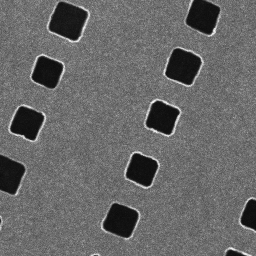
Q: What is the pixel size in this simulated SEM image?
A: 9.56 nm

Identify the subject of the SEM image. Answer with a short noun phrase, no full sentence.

holes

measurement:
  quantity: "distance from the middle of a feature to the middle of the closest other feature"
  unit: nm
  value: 526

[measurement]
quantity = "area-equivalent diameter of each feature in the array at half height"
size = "294 nm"